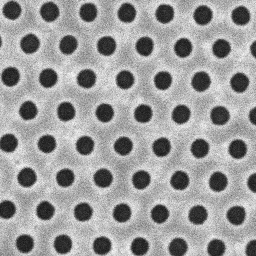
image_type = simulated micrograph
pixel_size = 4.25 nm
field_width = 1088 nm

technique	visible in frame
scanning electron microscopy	a regular array of holes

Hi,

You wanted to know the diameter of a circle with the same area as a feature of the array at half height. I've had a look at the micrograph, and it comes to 81 nm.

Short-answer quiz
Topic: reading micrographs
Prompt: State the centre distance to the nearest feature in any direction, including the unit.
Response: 161 nanometres